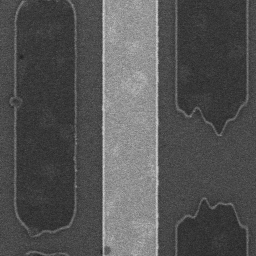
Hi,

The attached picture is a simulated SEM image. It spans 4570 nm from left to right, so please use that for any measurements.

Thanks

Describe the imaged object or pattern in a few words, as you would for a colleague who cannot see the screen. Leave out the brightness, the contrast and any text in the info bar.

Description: one or a few lines or trenches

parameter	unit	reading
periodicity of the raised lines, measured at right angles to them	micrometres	1.5